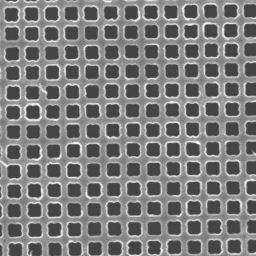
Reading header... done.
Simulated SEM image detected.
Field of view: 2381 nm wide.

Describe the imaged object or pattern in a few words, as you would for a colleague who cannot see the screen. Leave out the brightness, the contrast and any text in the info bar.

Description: a regular array of holes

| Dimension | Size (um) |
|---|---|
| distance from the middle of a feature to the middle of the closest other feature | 0.18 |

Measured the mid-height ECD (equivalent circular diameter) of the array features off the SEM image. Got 134 nanometres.